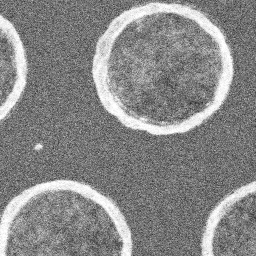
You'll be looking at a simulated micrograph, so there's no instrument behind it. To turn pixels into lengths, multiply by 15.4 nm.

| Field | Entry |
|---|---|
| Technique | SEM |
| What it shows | raised bodies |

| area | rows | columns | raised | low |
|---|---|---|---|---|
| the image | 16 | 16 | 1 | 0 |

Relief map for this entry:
0000000000000000
0000000011111000
1000000111111100
1000001111111100
1000001111111100
1000001111111100
1000000111111000
0000000011110000
0000000000000000
0000000000000000
0000000000000000
0000000000000000
0111110000000011
0111111000000111
1111111100000111
1111111100000111